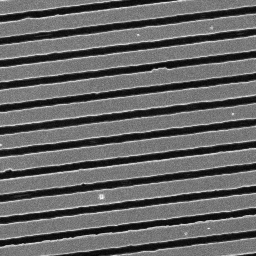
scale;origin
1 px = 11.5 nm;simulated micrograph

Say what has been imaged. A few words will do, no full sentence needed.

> parallel lines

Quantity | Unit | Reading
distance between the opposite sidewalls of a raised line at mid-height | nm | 180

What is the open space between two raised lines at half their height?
0.0785 microns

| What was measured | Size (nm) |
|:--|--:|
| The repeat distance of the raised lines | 256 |